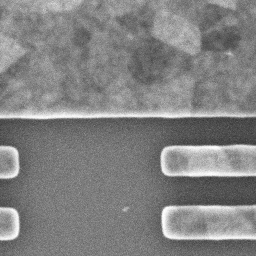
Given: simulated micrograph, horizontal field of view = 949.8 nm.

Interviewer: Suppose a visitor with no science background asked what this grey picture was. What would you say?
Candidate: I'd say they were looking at wiring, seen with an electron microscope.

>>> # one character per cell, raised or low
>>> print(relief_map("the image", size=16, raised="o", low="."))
oooooooooooooooo
oooooooooooooooo
oooooooooooooooo
oooooooooooooooo
oooooooooooooooo
oooooooooooooooo
oooooooooooooooo
................
................
o.........oooooo
o.........oooooo
................
................
o.........oooooo
o.........oooooo
................